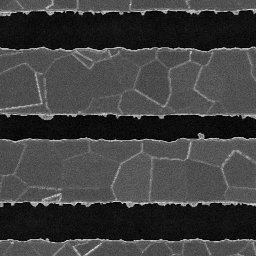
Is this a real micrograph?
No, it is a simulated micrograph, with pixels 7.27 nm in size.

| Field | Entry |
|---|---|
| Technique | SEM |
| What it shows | lines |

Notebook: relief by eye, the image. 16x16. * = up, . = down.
****************
................
................
****************
****************
****************
****************
................
................
****************
****************
****************
****************
................
................
****************